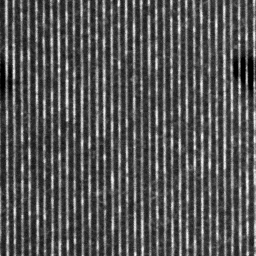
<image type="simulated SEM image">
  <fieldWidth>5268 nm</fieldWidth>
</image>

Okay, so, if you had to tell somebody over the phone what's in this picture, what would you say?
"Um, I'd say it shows parallel lines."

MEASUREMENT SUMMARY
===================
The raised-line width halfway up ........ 1.5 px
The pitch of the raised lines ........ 7.5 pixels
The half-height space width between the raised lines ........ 0.121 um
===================